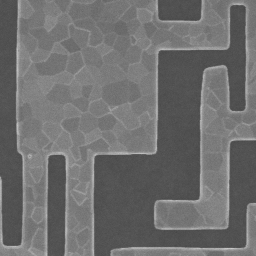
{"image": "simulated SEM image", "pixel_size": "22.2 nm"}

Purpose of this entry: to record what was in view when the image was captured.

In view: wiring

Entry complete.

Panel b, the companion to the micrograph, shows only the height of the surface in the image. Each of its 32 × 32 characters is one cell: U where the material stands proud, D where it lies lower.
DDUUUUUUUUUUUUUUUUUUDDDDDUUUUDUU
DDUUUUUUUUUUUUUUUUUUDDDDDUUUUDDU
DDUUUUUUUUUUUUUUUUUUDDDDDUUUUDDU
DDUUUUUUUUUUUUUUUUUUUUUUUUUUUDDU
DDUUUUUUUUUUUUUUUUUUUUUUUUUUUDDU
DDUUUUUUUUUUUUUUUUUUUUUUUUUUUDDU
DDUUUUUUUUUUUUUUUUUUDDDDDDDDDDDU
DDUUUUUUUUUUUUUUUUUUDDDDDDDDDDDU
DDUUUUUUUUUUUUUUUUUUDDDDDDUUDDDU
DDUUUUUUUUUUUUUUUUUUDDDDDUUUDDDU
DDUUUUUUUUUUUUUUUUUUDDDDDUUUUDDU
DDUUUUUUUUUUUUUUUUUUDDDDDUUUUDDU
DDUUUUUUUUUUUUUUUUUUDDDDDUUUUDDU
DDUUUUUUUUUUUUUUUUUUDDDDDUUUUDDU
DDUUUUUUUUUUUUUUUUUUDDDDDUUUUUUU
DDUUUUUUUUUUUUUUUUUUDDDDDUUUUUUU
DDUUUUUUUUUUUUUUUUUDDDDDDUUUUUUU
DDUUUUUUUUUUUUUUUUUDDDDDDUUUUDDD
DDUUUUUUUUUUUUUUUUUDDDDDDUUUUDDD
DDDUUUDDUUUUDDDDDDDDDDDDDUUUUDDD
DDDUUUDDUUUUDDDDDDDDDDDDDUUUUDDD
DDDUUUDDUUUUDDDDDDDDDDDDDUUUUDDD
DDDUUUDDUUUUDDDDDDDDDDDDDUUUUDDD
DDDUUUDDUUUUDDDDDDDDDDDDDUUUUDDD
DDDUUUDDUUUUDDDDDDDDDDDDDUUUUDDD
DDDUUUDDUUUUDDDDDDDDUUUUUUUUUDDU
DDDUUUDDUUUUDDDDDDDUUUUUUUUUUDDU
DDDUUUDDUUUUDDDDDDDUUUUUUUUUUDDU
DDDUUUDDUUUUDDDDDDDDUUUUUUUUDDDU
DDDUUUDDUUUUDDDDDDDDDDDDDDDDDDDU
DDDUUUDDUUUUDDDDDDDDDDDDDDDDDDDU
UUUUUUDDUUUUDDUUUUUUUUUUUUUUUUUU